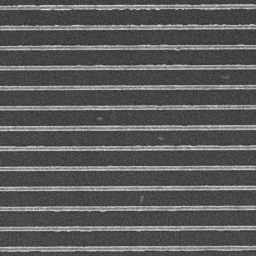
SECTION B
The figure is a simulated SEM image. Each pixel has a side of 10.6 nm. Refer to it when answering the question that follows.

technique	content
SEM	parallel lines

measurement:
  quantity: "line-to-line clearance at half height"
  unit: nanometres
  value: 183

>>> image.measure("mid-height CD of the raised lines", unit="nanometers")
38.4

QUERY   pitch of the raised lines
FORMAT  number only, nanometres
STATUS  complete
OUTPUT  213